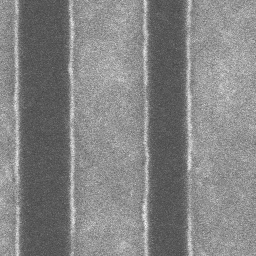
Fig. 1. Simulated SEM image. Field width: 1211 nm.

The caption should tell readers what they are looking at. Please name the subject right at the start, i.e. one or a few lines or trenches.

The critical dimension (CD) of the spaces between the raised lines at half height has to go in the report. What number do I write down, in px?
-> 70.6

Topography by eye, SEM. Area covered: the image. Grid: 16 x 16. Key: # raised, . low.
.####....###....
.####....###....
.####....###....
.####....###....
.####....###....
.####....###....
.####....###....
.####....###....
.####....###....
.####....###....
.####....###....
.####....###....
.####....###....
.####....###....
.####....###....
.####....###....